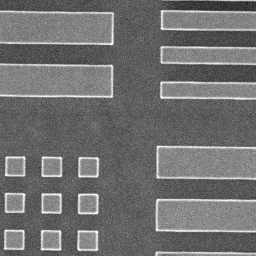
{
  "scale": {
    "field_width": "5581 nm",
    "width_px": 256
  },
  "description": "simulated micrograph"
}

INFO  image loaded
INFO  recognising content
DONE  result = groups of lines, slits or small figures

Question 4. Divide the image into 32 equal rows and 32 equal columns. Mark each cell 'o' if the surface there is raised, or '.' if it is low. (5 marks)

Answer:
................................
ooo.................oooooooo....
oooooooooooooo......oooooooooooo
oooooooooooooo......oooooooooooo
oooooooooooooo..................
............oo..................
....................oooooooooooo
....................oooooooooooo
oooooooooooooo..................
oooooooooooooo..................
oooooooooooooo......oooooooooooo
oooooooooooooo......oooooooooooo
................................
................................
................................
................................
................................
................................
....................oooooooooooo
....................oooooooooooo
.oo..ooo..oo........oooooooooooo
.oo..ooo..oo........oooooooooooo
................................
................................
.oo..ooo..oo....................
.oo..ooo..oo........oooooooooooo
......o...oo........oooooooooooo
....................oooooooooooo
....................oooooooooooo
.oo..ooo..oo....................
.oo..ooo..oo....................
................................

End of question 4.